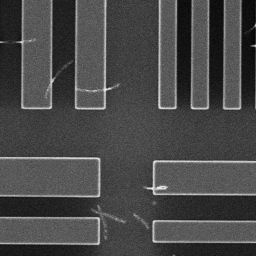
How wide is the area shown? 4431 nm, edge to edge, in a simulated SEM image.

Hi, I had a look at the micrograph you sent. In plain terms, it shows groups of lines, slits or small figures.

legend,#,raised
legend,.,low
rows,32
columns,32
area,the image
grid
...###....###.......##..##..##..
...###....###.......##..##..##..
...###....###.......##..##..##..
...###....###.......##..##..##..
...###...####.......##..##..##..
...###...####.......##..##..##..
...###...####.......##..##..##..
...###...####.......##..##..##..
...###...####.......##..##..##..
...####..####.......##..##..##..
...####..####.......##..##..##..
...###...####.......##..##..##..
...###...####.......##..##..##..
...###....###.......##..##..##..
................................
................................
................................
................................
................................
................................
############.......#############
############.......#############
############.......#############
############.......#############
############....................
................................
................................
############....................
############.......#############
############.......#############
...#########....................
................................